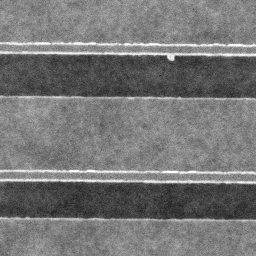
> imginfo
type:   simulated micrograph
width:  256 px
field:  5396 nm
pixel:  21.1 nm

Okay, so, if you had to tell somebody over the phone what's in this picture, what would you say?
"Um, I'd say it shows lines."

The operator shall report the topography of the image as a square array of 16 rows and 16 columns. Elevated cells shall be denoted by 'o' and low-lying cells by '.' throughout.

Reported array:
oooooooooooooooo
oooooooooooooooo
oooooooooooooooo
..........o.....
................
................
oooooooooooooooo
oooooooooooooooo
oooooooooooooooo
oooooooooooooooo
oooooooooooooooo
................
................
................
oooooooooooooooo
oooooooooooooooo